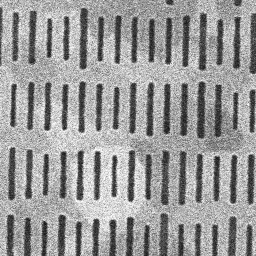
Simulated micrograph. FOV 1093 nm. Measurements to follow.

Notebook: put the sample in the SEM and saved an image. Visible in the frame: a regular array of holes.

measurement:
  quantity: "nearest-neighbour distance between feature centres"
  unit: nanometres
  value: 72.3